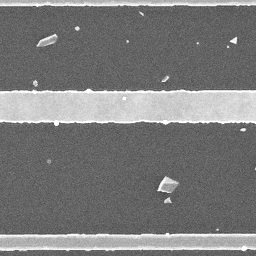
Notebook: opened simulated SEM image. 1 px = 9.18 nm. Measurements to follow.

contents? lines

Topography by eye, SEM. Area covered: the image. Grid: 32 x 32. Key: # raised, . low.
################################
................................
................................
................................
................................
................................
................................
................................
................................
................................
................................
.##.###.####.#...##.############
################################
################################
################################
................................
................................
................................
................................
................................
................................
................................
................................
....................#...........
................................
................................
................................
................................
................................
################################
################################
................................